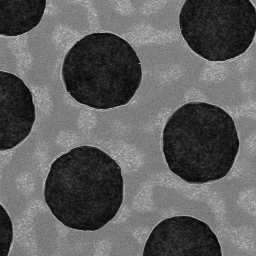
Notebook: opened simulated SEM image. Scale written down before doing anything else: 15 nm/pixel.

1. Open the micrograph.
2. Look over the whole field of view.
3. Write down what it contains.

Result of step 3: holes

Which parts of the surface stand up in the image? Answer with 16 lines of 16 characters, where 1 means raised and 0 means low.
0001111111100000
0011111111100000
1111100011110000
1111000001111001
1111000001111111
0011000001111111
0011100011110111
0011111111100001
0011111111000001
1111001111000001
1110000111100011
1110000011111111
1110000011111111
0110000111111111
0111111110000111
0111111110000011